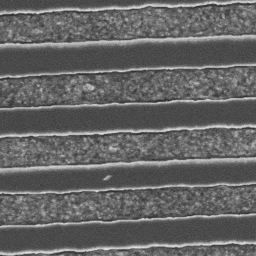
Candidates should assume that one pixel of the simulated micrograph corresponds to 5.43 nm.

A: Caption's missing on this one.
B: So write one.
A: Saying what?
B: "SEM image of lines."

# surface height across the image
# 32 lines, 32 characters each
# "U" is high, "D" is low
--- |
UUUUUUUUUUUUUUUUUUUUUUUUUUDUDDDD
UUUUUUDDDDDDDDDDDDDDDDDDDDDDDDDD
DDDDDDDDDDDDDDDDDDDDDDDDDDDDDDDD
DDDDDDDDDDDDDDDDDDDDDDDDDDDDDDDD
DDDDDDDDDDDDDDDDDDDDDDDDDDDDDDDD
DDDDDUUDDUUUUUUUUUUUUUUUUUUUUUUU
UUUUUUUUUUUUUUUUUUUUUUUUUUUUUUUU
UUUUUUUUUUUUUUUUUUUUUUUUUUUUUUUU
UUUUUUUUUUUUUUUUUUUUUUDDUUDDDDDD
UUUUDDDDDDDDDDDDDDDDDDDDDDDDDDDD
DDDDDDDDDDDDDDDDDDDDDDDDDDDDDDDD
DDDDDDDDDDDDDDDDDDDDDDDDDDDDDDDD
DDDDDDDDDDDDDDDDDDDDDDDDDUUDUUUU
DUUUUUUUUUUUUUUUUUUUUUUUUUUUUUUU
UUUUUUUUUUUUUUUUUUUUUUUUUUUUUUUU
UUUUUUUUUUUUUUUUUUUUUUUUUUUUUUUU
UUUUUUUUUUUUUUUDUUDDDDDDDDDDDDDD
DDDDDDDDDDDDDDDDDDDDDDDDDDDDDDDD
DDDDDDDDDDDDDDDDDDDDDDDDDDDDDDDD
DDDDDDDDDDDDDDDDDDDDDDDDDDDDDDDD
DDDDDDDDDDDDDDUUUUUUUUUUUUUUUUUU
UUUUUUUUUUUUUUUUUUUUUUUUUUUUUUUU
UUUUUUUUUUUUUUUUUUUUUUUUUUUUUUUU
UUUUUUUUUUUUUUUUUUUDDDDDDDDDDDDD
DDDDDDDDDDDDDDDDDDDDDDDDDDDDDDDD
DDDDDDDDDDDDDDDDDDDDDDDDDDDDDDDD
DDDDDDDDDDDDDDDDDDDDDDDDDDDDDDDD
DDDDDDDDDDDDDDDDDUUUUUUUUUUUUUUU
UUUUUUUUUUUUUUUUUUUUUUUUUUUUUUUU
UUUUUUUUUUUUUUUUUUUUUUUUUUUUUUUU
UUUUUUUUUUUUUUUUUUUUUUUUUUUUDDUD
UUUUUUUDDDDDDDDDDDDDDDDDDDDDDDDD